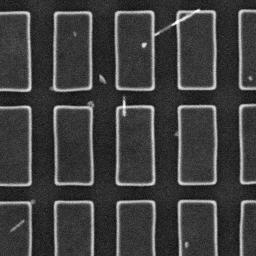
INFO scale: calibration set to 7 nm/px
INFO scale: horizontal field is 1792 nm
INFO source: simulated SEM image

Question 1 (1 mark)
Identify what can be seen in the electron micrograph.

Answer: groups of lines, slits or small figures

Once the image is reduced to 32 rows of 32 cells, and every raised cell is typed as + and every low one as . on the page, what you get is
................................
..................+....++++...++
++++...++++....++++...+++++...++
++++...++++....++++...+++++...++
++++...++++....++++...+++++...++
++++...++++....++++...+++++...++
++++...++++....++++...+++++...++
++++...++++....++++...+++++...++
++++...++++....++++...+++++...++
++++...++++....++++...+++++...++
++++...++++....++++...+++++...++
................................
................................
+++....++++....++++....++++...++
++++...++++....++++...+++++...++
++++...++++....++++...+++++...++
++++...++++....++++...+++++...++
++++...++++....++++...+++++...++
++++...++++....++++...+++++...++
++++...+++++...++++...+++++...++
++++...+++++...++++...+++++...++
++++...+++++...++++...+++++...++
++++...+++++...++++...+++++...++
................................
................................
++++...++++....++++...+++++...++
++++...+++++...++++...+++++...++
++++...+++++...++++...+++++...++
++++...+++++...++++...+++++...++
++++...+++++...++++...+++++...++
++++...+++++...++++...+++++...++
++++...+++++...++++...+++++...++